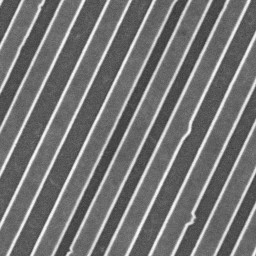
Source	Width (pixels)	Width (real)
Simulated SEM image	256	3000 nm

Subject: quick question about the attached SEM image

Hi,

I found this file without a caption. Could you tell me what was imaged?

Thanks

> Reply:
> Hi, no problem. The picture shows parallel lines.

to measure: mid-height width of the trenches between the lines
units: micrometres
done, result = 0.198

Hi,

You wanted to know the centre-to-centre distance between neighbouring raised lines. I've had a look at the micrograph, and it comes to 436 nm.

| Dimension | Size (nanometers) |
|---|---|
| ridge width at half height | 229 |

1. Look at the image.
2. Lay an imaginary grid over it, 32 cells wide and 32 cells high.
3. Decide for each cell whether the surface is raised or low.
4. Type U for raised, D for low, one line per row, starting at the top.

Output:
DDDUUDDDUUDDDUUUDDDUUUDDUUDDUUUD
DDUUUDDUUUDDDUUUDDDUUDDUUUDDUUDD
DDUUDDDUUDDDUUUDDDUUUDDUUDDUUUDD
DUUUDDUUUDDDUUUDDDUUDDUUUDDUUDDD
DUUDDDUUDDDUUUDDDUUUDDUUDDUUUDDD
UUUDDUUUDDDUUUDDDUUDDUUUDDUUUDDU
UUDDDUUDDDUUUDDDUUUDDUUDDUUUDDDU
UUDDUUUDDDUUUDDDUUDDUUUDDUUUDDUU
UDDDUUDDDDUUDDDUUUDDUUDDUUUDDDUU
UDDUUUDDDUUUDDDUUDDUUUDDUUUDDUUU
DDDUUDDDDUUDDDUUUDDUUDDUUUDDDUUU
DDUUUDDDUUUDDDUUDDUUUDDUUUDDDUUD
DDUUDDDDUUDDDUUUDDUUDDDUUDDDUUUD
DUUUDDDUUUDDDUUDDUUUDDUUUDDDUUDD
DUUUDDDUUDDDUUUDDUUDDDUUDDDUUUDD
UUUDDDUUUDDDUUDDUUUDDUUUDDDUUDDD
UUUDDDUUDDDUUUDDUUDDDUUUDDUUUDDU
UUDDDUUUDDDUUUDUUUDDUUUDDDUUDDDU
UUDDDUUDDDUUUDDUUUDDUUDDDUUUDDUU
UDDDUUUDDDUUUDUUUDDUUUDDDUUDDDUU
UDDDUUDDDUUUDDUUUDDUUDDDUUUDDUUU
DDDUUUDDDUUUDUUUDDUUUDDDUUUDDUUU
DDDUUDDDUUUDDUUUDDUUDDDUUUDDDUUD
DDUUUDDDUUUDUUUDDUUUDDDUUUDDUUUD
DDUUUDDDUUDDUUUDDUUDDDUUUDDDUUDD
DUUUDDDUUUDDUUDDUUUDDDUUUDDUUUDD
DUUUDDDUUDDUUUDDUUDDDUUUDDDUUUDD
UUUDDDUUUDDUUDDUUUDDDUUUDDUUUDDU
UUUDDDUUDDUUUDDUUDDDUUUDDDUUUDDU
UUDDDUUUDDUUDDUUUDDDUUUDDUUUDDUU
UUDDDUUDDUUUDDUUUDDUUUDDDUUUDDUU
UDDDUUUDDUUDDUUUDDDUUUDDUUUDDUUU